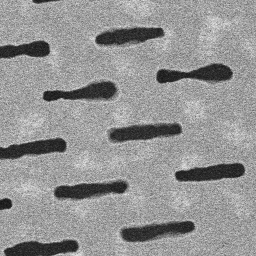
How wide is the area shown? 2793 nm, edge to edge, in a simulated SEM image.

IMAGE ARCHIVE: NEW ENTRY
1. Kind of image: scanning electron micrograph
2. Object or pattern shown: holes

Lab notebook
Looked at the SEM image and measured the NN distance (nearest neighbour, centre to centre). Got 850 nm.